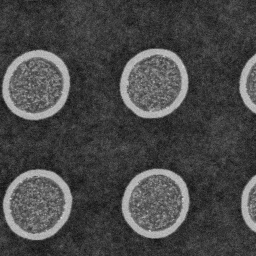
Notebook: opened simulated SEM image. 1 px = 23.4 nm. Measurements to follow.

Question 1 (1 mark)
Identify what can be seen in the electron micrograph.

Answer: raised bodies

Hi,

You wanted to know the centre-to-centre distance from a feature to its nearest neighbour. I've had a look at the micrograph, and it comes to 2770 nm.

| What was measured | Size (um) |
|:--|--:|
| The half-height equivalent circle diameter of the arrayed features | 1.46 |